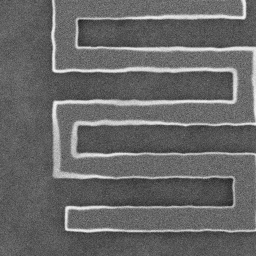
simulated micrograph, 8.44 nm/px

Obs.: groups of lines, slits or small figures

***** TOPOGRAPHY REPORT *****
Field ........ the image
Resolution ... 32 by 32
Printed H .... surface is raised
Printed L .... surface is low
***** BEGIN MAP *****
LLLLLLLHHHHHHHHHHHHHHHHHHHHHHHHL
LLLLLLLHHHHHHHHHHHHHHHHHHHHHHHHL
LLLLLLLHHHLLLLLLLLLLLLLLLLLLLLLL
LLLLLLLHHHLLLLLLLLLLLLLLLLLLLLLL
LLLLLLLHHHLLLLLLLLLLLLLLLLLLLLLL
LLLLLLLHHHLLLLLLLLLLLLLLLLLLLLLL
LLLLLLLHHHHHHHHHHHHHHHHHHHHHHHHH
LLLLLLLHHHHHHHHHHHHHHHHHHHHHHHHH
LLLLLLLHHHHHHHHHHHHHHHHHHHHHHHHH
LLLLLLLLLLLLLLLLLLLLLLLLLLLLLHHH
LLLLLLLLLLLLLLLLLLLLLLLLLLLLLHHH
LLLLLLLLLLLLLLLLLLLLLLLLLLLLLHHH
LLLLLLLLLLLLLLLLLLLLLLLLLLLLLHHH
LLLLLLLHHHHHHHHHHHHHHHHHHHHHHHHH
LLLLLLLHHHHHHHHHHHHHHHHHHHHHHHHH
LLLLLLLHHHLHLLLLLLLLHHHHHHHHHHHH
LLLLLLLHHLLLLLLLLLLLLLLLLLLLLLLL
LLLLLLLHHLLLLLLLLLLLLLLLLLLLLLLL
LLLLLLLHHLLLLLLLLLLLLLLLLLLLLLLL
LLLLLLLHHHHHHHHHHHHHHHHHHHHHHHHH
LLLLLLLHHHHHHHHHHHHHHHHHHHHHHHHH
LLLLLLLHHHHHHHHHHHHHHHHHHHHHHHHH
LLLLLLLLLLLLLLLLLLLLLLLLLLLLLHHH
LLLLLLLLLLLLLLLLLLLLLLLLLLLLLHHH
LLLLLLLLLLLLLLLLLLLLLLLLLLLLLHHH
LLLLLLLLLLLLLLLLLLLLLLLLLLLLLHHH
LLLLLLLLHHHHHHHHHHHHHHHHHHHHHHHH
LLLLLLLLHHHHHHHHHHHHHHHHHHHHHHHH
LLLLLLLLHHHHHHHHHHHHHHHHHHHHHHHH
LLLLLLLLLLLLLLLLLLLLLLLLLLLLLLLL
LLLLLLLLLLLLLLLLLLLLLLLLLLLLLLLL
LLLLLLLLLLLLLLLLLLLLLLLLLLLLLLLL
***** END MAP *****